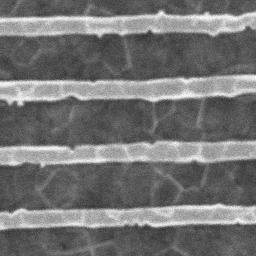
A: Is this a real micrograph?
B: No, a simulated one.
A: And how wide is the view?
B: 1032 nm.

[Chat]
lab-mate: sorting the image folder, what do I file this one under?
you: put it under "parallel lines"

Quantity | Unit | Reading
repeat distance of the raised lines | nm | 258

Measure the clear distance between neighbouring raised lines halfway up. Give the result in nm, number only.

192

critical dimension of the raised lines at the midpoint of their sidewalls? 66 nm